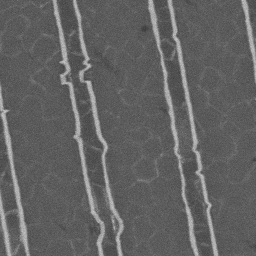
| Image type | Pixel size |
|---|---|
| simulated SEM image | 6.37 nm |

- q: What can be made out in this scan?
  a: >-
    one or a few lines or trenches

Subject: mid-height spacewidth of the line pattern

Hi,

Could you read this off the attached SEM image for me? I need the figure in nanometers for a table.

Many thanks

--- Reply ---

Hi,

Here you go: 458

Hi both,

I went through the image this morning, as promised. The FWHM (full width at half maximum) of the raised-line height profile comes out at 129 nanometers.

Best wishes